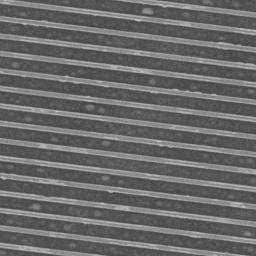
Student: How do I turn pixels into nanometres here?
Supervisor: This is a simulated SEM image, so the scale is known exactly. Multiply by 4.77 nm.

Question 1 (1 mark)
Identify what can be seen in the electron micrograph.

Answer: parallel lines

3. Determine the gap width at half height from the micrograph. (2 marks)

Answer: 61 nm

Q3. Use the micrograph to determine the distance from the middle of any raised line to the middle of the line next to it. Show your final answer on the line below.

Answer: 82.6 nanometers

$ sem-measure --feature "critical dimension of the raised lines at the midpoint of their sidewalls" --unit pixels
4.84